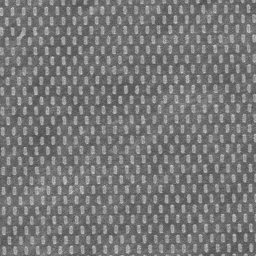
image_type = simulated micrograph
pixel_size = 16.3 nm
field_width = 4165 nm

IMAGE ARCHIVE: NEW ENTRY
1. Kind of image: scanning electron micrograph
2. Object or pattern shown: a regular array of raised bodies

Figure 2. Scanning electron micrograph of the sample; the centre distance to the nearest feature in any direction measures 0.179 um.